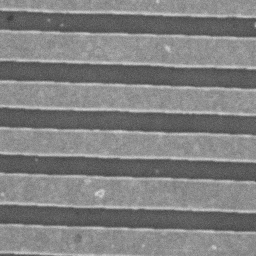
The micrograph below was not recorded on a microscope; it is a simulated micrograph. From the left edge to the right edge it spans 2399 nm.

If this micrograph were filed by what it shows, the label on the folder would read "lines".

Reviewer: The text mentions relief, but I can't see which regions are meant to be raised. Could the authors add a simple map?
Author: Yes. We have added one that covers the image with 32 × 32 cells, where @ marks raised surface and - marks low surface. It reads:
@@@@@@@@@@@@@@@@@@@@@@@@@@@@@@@@
-----------@@@@@@@@@@@@@@@@@@@@@
--------------------------------
--------------------------------
@@@@@@@@@@@@@@@@@@@@@@@---------
@@@@@@@@@@@@@@@@@@@@@@@@@@@@@@@@
@@@@@@@@@@@@@@@@@@@@@@@@@@@@@@@@
@@@@@@@@@@@@@@@@@@@@@@@@@@@@@@@@
--------------------------------
--------------------------------
@@@@@@@@@@@---------------------
@@@@@@@@@@@@@@@@@@@@@@@@@@@@@@@@
@@@@@@@@@@@@@@@@@@@@@@@@@@@@@@@@
----@@@@@@@@@@@@@@@@@@@@@@@@@@@@
--------------------------------
--------------------------------
@@@@@@@@@@@@@@@-----------------
@@@@@@@@@@@@@@@@@@@@@@@@@@@@@@@@
@@@@@@@@@@@@@@@@@@@@@@@@@@@@@@@@
-----------@@@@@@@@@@@@@@@@@@@@@
--------------------------------
--------------------------------
@@@@@@@@@@@@@@@@@@@@@@@---------
@@@@@@@@@@@@@@@@@@@@@@@@@@@@@@@@
@@@@@@@@@@@@@@@@@@@@@@@@@@@@@@@@
----@@@@@@@@@@@@@@@@@@@@@@@@@@@@
-------------------------------@
--------------------------------
@@@@@@@@@@@---------------------
@@@@@@@@@@@@@@@@@@@@@@@@@@@@@@@@
@@@@@@@@@@@@@@@@@@@@@@@@@@@@@@@@
@@@@@@@@@@@@@@@@@@@@@@@@@@@@@@@@